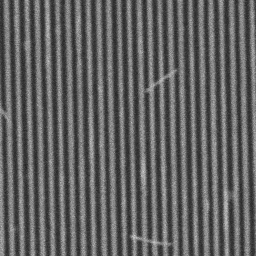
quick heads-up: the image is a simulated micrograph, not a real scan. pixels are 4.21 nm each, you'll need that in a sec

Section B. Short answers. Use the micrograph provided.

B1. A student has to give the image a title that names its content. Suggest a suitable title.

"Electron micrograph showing parallel lines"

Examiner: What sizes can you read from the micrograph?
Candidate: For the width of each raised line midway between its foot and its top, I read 20.5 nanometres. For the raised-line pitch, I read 43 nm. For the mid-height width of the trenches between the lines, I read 5.87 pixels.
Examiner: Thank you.